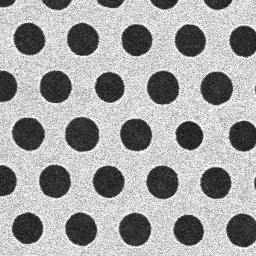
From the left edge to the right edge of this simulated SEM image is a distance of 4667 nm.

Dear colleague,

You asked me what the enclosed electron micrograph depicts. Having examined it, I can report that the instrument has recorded a regular array of holes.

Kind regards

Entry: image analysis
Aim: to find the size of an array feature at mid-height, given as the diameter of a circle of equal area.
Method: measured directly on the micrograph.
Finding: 601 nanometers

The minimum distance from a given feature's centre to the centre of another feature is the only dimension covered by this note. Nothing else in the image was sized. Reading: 977 nanometres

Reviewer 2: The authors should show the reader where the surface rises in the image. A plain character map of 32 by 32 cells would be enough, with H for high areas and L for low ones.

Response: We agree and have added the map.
LLHHHLLLLHHHLLLHHHHLLLHHHHLLLHHH
HHHHHHHHHHHHHHHHHHHHHHHHHHHHHHHH
HHHHHHHHHHHHHHHHHHHHHHHHHHHHHHHH
HHLLLHHHHLLLHHHHLLHHHHHLLHHHHHLH
HHLLLLHHLLLLHHHLLLLHHHLLLLHHHLLL
HHLLLLHHLLLLHHHLLLLHHHLLLLHHHLLL
HHLLLHHHHLLLHHHHLLHHHHLLLHHHHLLL
HHHHHHHHHHHHHHHHHHHHHHHHHHHHHHHH
HHHHHHHHHHHHHHHHHHHHHHHHHHHHHHHH
LLHHHLLLHHHHLLLHHHHLLLHHHHLLLHHH
LLHHHLLLLHHHLLLLHHLLLLHHHLLLLHHH
LLHHHLLLLHHHLLLLHHLLLLHHHLLLLHHH
LHHHHHLLHHHHHLLHHHHLLLHHHHLLLHHH
HHHHHHHHHHHHHHHHHHHHHHHHHHHHHHHH
HHHHHHHHHHHHHHHHHHHHHHHHHHHHHHHH
HHLLLHHHHLLLHHHLLLHHHHHLLHHHHLLL
HLLLLLHHLLLLHHHLLLLHHHLLLHHHHLLL
HHLLLHHHLLLLHHHLLLLHHHLLLHHHHLLL
HHHLLHHHHLLLHHHHLLHHHHHLLHHHHLLL
HHHHHHHHHHHHHHHHHHHHHHHHHHHHHHHH
HHHHHHHHHHHHHHHHHHHHHHHHHHHHHHHH
LLHHHLLLLHHHLLLHHHHLLLHHHHLLHHHH
LLHHHLLLLHHHLLLLHHLLLLHHHLLLLHHH
LLHHHLLLLHHHLLLHHHLLLLHHHLLLLHHH
LHHHHHLLHHHHHLLHHHHLLHHHHHLLHHHH
HHHHHHHHHHHHHHHHHHHHHHHHHHHHHHHH
HHHHHHHHHHHHHHHHHHHHHHHHHHHHHHHH
HHLLLHHHLLLLHHHLLLLHHHLLLHHHHLLL
HLLLLHHHLLLLHHHLLLLHHHLLLHHHLLLL
HHLLLHHHLLLLHHHLLLLHHHLLLHHHLLLL
HHHLHHHHHLLHHHHHLLHHHHHLLHHHHLLL
HHHHHHHHHHHHHHHHHHHHHHHHHHHHHHHH